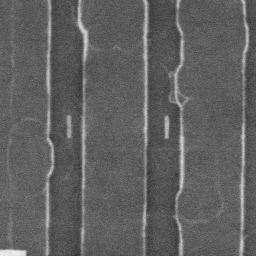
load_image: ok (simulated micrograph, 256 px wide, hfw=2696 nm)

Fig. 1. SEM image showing wiring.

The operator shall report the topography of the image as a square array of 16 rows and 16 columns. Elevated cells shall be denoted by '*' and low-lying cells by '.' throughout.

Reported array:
***..****..****.
***..****..****.
***..****..****.
***..****..****.
***..****..****.
***..****..****.
***..****..****.
***..****..****.
***..****..****.
***..****..****.
***..****..****.
***..****..****.
***..****..****.
***..****..****.
***..****..****.
***..****..****.